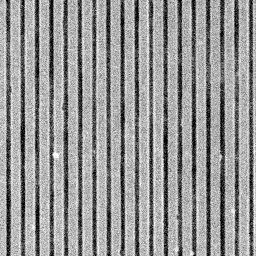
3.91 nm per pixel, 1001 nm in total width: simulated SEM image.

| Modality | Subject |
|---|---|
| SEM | parallel lines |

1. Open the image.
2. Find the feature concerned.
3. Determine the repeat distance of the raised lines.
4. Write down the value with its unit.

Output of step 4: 55.7 nm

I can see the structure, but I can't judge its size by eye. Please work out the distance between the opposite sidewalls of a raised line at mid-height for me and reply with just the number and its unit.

33.7 nm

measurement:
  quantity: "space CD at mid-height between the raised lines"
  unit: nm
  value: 22.5